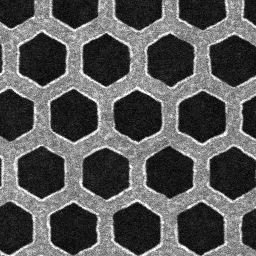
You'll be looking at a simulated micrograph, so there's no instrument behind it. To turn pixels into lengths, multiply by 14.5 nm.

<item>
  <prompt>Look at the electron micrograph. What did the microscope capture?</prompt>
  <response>a regular array of holes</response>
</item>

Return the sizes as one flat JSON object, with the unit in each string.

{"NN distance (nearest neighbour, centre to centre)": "64 px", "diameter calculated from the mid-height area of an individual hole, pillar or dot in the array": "714 nm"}